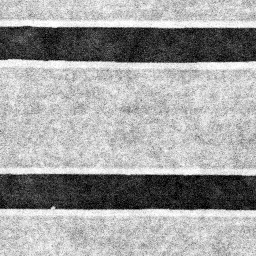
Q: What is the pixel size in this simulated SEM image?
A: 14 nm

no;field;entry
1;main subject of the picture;one or a few lines or trenches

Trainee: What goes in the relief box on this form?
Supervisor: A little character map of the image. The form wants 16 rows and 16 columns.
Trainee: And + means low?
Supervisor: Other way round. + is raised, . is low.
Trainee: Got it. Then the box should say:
++++++++++++++++
.........+++++++
................
................
++++++++++++++++
++++++++++++++++
++++++++++++++++
++++++++++++++++
++++++++++++++++
++++++++++++++++
++++++++++++++++
................
................
++++++++++++++++
++++++++++++++++
++++++++++++++++